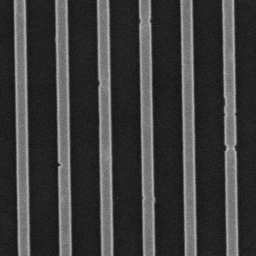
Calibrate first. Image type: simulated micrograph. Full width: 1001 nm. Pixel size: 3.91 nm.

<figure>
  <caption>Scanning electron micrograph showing parallel lines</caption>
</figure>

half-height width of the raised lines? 0.0405 microns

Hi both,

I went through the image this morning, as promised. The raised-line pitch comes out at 41.6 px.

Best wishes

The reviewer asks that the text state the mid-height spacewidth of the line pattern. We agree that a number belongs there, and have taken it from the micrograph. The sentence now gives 121 nm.